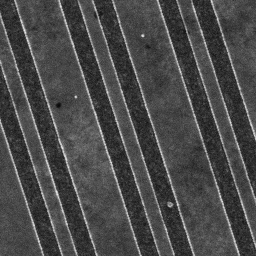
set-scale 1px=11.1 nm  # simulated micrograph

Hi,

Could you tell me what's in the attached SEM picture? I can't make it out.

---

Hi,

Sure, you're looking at lines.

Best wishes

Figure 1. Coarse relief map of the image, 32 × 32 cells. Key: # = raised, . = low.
..######..##..######..##...#####
..######..##..######...#...#####
...#####...#...######..##..#####
#..######..##..######..##..#####
#..######..##..######..##...####
#...#####..##...######..##..####
##..#####...##..######..##..####
##..######..##..######..##...###
##..######..##...######..##..###
.#...#####...##..##########..###
.##..######..##..######.###...##
.##..######..##...#####...##..##
..##..#####...##..######..##..##
..##..######..##..######..##...#
..##..######..##...#####...##..#
..##...#####...##..######..##..#
#..##..######..##..######..##...
#..##..######..##...#####...##..
#..##...#####...##..######..##..
##..##..######..##..######..##..
##..##..######..##..######...##.
##..##...#####...#...######..##.
##...##..######..##..######..##.
###..##..######..##..######...#.
###..##...#####...#...######..##
###...##..######..##..######..##
####..##..######..##..######...#
####..##...#####..##...######..#
####...##..######..##..######..#
#####..##..######..##..######..#
#####..##...#####..##...######..
#####...##..######..##..######..